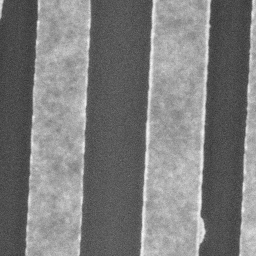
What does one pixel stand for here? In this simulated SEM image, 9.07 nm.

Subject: lines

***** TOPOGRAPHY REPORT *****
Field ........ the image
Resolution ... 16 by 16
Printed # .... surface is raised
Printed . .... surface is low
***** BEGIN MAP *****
..####....###...
..####...####...
..####...####...
..###....####...
..###....####...
..###....####...
..###....####..#
..###....####..#
..###....####..#
..###....####..#
..###....####..#
..###....####..#
..###....####..#
..###....###...#
..###....###...#
..###....###...#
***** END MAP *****